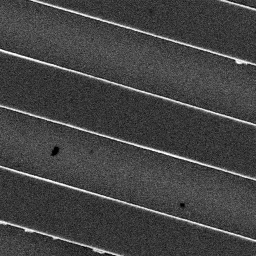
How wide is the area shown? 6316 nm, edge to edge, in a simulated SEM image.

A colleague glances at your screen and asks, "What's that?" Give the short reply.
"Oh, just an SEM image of lines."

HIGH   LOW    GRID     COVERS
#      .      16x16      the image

....############
.......#########
...........#####
#.............##
#####...........
########........
############....
...############.
......##########
..........######
.............###
####............
#######.........
###########.....
..############..
......##########